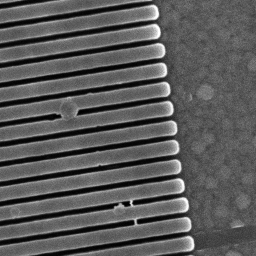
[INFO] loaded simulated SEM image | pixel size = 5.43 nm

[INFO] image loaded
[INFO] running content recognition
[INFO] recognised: parallel lines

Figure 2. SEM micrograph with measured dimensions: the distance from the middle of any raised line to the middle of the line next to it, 0.105 microns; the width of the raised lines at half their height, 75.8 nm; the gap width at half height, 27.5 nm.